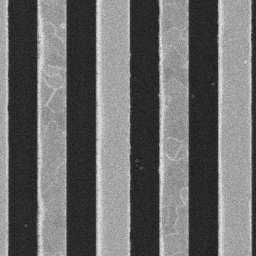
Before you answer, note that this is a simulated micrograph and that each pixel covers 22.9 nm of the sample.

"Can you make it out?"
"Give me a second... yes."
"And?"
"lines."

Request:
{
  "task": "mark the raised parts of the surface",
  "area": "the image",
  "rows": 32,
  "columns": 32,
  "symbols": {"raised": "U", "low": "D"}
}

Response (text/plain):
UDDDDUUUDDDDUUUUDDDDUUUDDDDUUUUD
UDDDDUUUDDDDUUUUDDDDUUUDDDDUUUUD
UDDDDUUUDDDDUUUUDDDDUUUDDDDUUUUD
UDDDDUUUDDDDUUUUDDDDUUUDDDDUUUUD
UDDDDUUUDDDDUUUUDDDDUUUDDDDUUUUD
UDDDDUUUDDDDUUUUDDDDUUUDDDDUUUUD
UDDDDUUUDDDDUUUUDDDDUUUDDDDUUUUD
UDDDDUUUDDDDUUUUDDDDUUUDDDDUUUUD
UDDDDUUUDDDDUUUUDDDDUUUDDDDUUUUD
UDDDDUUUDDDDUUUUDDDDUUUDDDDUUUUD
UDDDDUUUDDDDUUUUDDDDUUUDDDDUUUUD
UDDDDUUUDDDDUUUUDDDDUUUDDDDUUUUD
UDDDDUUUDDDDUUUUDDDDUUUDDDDUUUUD
UDDDDUUUDDDDUUUUDDDDUUUDDDDUUUUD
UDDDDUUUDDDDUUUUDDDDUUUDDDDUUUUD
UDDDDUUUDDDDUUUUDDDDUUUDDDDUUUUD
UDDDDUUUDDDDUUUUDDDDUUUDDDDUUUUD
UDDDDUUUDDDDUUUUDDDDUUUDDDDUUUUD
UDDDDUUUDDDDUUUUDDDDUUUDDDDUUUUD
UDDDDUUUDDDDUUUUDDDDUUUDDDDUUUUD
UDDDDUUUDDDDUUUUDDDDUUUDDDDUUUUD
UDDDDUUUDDDDUUUUDDDDUUUDDDDUUUUD
UDDDDUUUDDDDUUUUDDDDUUUDDDDUUUUD
UDDDDUUUDDDDUUUUDDDDUUUDDDDUUUUD
UDDDDUUUDDDDUUUUDDDDUUUDDDDUUUUD
UDDDDUUUDDDDUUUUDDDDUUUDDDDUUUUD
UDDDDUUUDDDDUUUUDDDDUUUDDDDUUUUD
UDDDDUUUDDDDUUUUDDDDUUUDDDDUUUUD
UDDDDUUUDDDDUUUUDDDDUUUDDDDUUUUD
UDDDDUUUDDDDUUUUDDDDUUUDDDDUUUUD
UDDDDUUUDDDDUUUUDDDDUUUDDDDUUUUD
UDDDDUUUDDDDUUUUDDDDUUUDDDDUUUUD